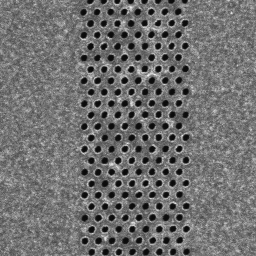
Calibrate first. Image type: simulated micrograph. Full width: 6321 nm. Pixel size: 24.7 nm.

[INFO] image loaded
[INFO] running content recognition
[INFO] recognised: a regular array of holes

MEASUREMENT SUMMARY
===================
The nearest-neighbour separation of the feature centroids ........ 322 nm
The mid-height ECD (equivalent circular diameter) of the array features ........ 172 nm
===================